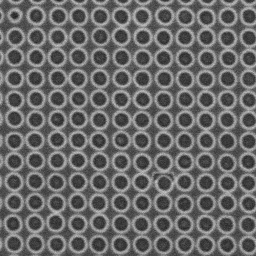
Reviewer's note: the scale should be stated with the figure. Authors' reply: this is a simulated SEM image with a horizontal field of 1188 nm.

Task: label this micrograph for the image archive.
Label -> a regular array of holes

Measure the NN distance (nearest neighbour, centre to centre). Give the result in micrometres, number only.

0.094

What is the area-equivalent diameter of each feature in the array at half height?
15.4 px